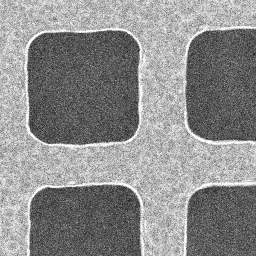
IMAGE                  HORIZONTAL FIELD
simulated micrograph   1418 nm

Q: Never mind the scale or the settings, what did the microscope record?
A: holes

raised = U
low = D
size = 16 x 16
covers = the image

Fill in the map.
UUUUUUUUUUUUUUUU
UUUUUUUUUUUUUUUU
UUDDDDDDUUUUDDDD
UUDDDDDDDUUUDDDD
UUDDDDDDDUUUDDDD
UUDDDDDDDUUUDDDD
UUDDDDDDDUUUDDDD
UUDDDDDDDUUUDDDD
UUDDDDDDUUUUDDDD
UUUUUUUUUUUUUUUU
UUUUUUUUUUUUUUUU
UUUUUUUUUUUUUUUU
UUDDDDDDDUUUDDDD
UUDDDDDDDUUUDDDD
UUDDDDDDDUUUDDDD
UUDDDDDDDUUUDDDD